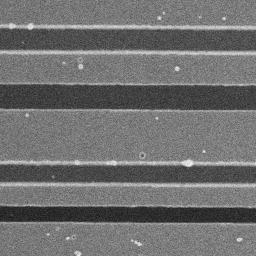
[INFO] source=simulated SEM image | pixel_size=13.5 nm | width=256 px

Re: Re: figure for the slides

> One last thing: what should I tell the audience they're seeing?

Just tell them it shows lines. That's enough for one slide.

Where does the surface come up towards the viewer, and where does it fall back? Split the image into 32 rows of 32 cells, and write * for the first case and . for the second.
********************************
********************************
********************************
...*............................
................................
................................
**..............................
********************************
********************************
********************************
........*..**.******************
................................
................................
................................
********************************
********************************
********************************
********************************
********************************
********************************
.......................*.......*
................................
................................
********************************
********************************
********************************
................................
................................
********************************
********************************
********************************
********************************